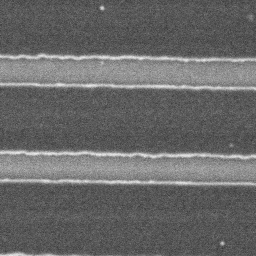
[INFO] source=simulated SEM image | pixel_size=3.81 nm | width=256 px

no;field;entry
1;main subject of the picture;lines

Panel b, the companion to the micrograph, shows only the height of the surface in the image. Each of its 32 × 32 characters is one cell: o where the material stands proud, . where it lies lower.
oooooooooooooooooooooooooooooooo
oooooooooooooooooooooooooooooooo
oooooooooooooooooooooooooooooooo
oooooooooooooooooooooooooooooooo
oooooooooooooooooooooooooooooooo
oooooooooooooooooooooooooooooooo
oooooooooooooooooooooooooooooooo
.......................ooo...oo.
................................
................................
................................
oooooooooooooooooooooooooooooooo
oooooooooooooooooooooooooooooooo
oooooooooooooooooooooooooooooooo
oooooooooooooooooooooooooooooooo
oooooooooooooooooooooooooooooooo
oooooooooooooooooooooooooooooooo
oooooooooooooooooooooooooooooooo
oooooooooooooooooooooooooooooooo
..................oooooo.ooooooo
................................
................................
o...............................
oooooooooooooooooooooooooooooooo
oooooooooooooooooooooooooooooooo
oooooooooooooooooooooooooooooooo
oooooooooooooooooooooooooooooooo
oooooooooooooooooooooooooooooooo
oooooooooooooooooooooooooooooooo
oooooooooooooooooooooooooooooooo
oooooooooooooooooooooooooooooooo
oooooooooooooooooooooooooooooooo